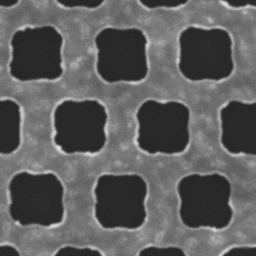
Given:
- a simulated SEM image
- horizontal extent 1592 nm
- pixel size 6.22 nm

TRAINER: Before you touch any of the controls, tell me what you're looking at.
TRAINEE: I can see a regular array of holes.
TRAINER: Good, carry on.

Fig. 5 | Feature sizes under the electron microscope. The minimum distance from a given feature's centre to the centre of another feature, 84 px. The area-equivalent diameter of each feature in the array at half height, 352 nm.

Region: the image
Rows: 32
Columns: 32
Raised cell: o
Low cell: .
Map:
..oooooo.....ooooo.....ooooo....
oooooooooooooooooooooooooooooooo
oooooooooooooooooooooooooooooooo
oooo...oooooooooooooooo..ooooooo
oo......oooo......oooo.......ooo
o.......oooo......oooo.......ooo
o.......oooo......ooooo......ooo
o.......oooo......oooo.......ooo
o.......oooo......oooo.......ooo
oo......ooooo.....ooooo.....oooo
oooooooooooooooooooooooooooooooo
oooooooooooooooooooooooooooooooo
oooooooo.o..oooooooooooooooooooo
..ooooo......oooo......ooooo....
...oooo......oooo.......oooo....
...oooo......oooo......ooooo....
..ooooo......oooo.......oooo....
...oooo......oooo.......oooo....
..oooooo.....ooooo.....ooooo....
oooooooooooooooooooooooooooooooo
oooooooooooooooooooooooooooooooo
oooooooooooooooooooooooooooooooo
o......ooooo......ooooo.....oooo
o.......oooo......oooo.......ooo
o.......oooo......oooo.......ooo
o.......oooo......ooooo......ooo
o.......oooo......oooo.......ooo
oo......oooo......ooooo......ooo
ooooooooooooo.oo.ooooooo.oo.oooo
oooooooooooooooooooooooooooooooo
oooooooooooooooooooooooooooooooo
..ooooo.....oooooo.....ooooo....